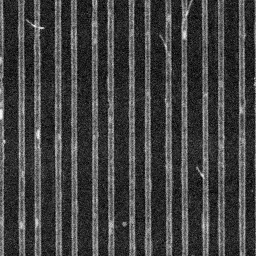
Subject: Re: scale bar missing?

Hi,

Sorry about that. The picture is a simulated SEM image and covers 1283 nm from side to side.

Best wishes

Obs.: parallel lines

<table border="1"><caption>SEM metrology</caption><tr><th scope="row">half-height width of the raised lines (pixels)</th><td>5.13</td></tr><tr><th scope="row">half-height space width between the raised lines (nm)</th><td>56.4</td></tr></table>